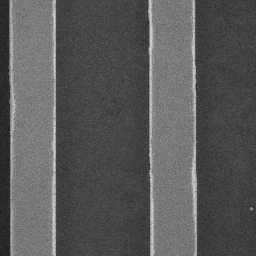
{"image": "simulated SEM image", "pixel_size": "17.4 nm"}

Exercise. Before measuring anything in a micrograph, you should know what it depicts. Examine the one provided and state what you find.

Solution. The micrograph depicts lines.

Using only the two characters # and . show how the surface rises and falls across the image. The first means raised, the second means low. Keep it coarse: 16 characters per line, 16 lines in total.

.##......###....
.##......###....
.##......###....
.##......###....
.##......###....
.##......###....
.##......###....
.##......###....
.##......###....
.##......###....
.##......###....
.##......###....
.##......###....
.##......###....
.##......###....
.##......###....